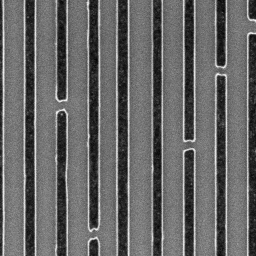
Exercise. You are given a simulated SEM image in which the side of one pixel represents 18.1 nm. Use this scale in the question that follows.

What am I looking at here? parallel lines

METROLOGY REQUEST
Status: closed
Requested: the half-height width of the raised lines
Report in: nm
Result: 197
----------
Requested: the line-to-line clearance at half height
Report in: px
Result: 20.9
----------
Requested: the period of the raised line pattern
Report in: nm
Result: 576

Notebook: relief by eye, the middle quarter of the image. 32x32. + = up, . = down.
+.....+++....+++......+++.....++
+.....+++....+++......+++.....++
+.....+++....+++......+++.....++
+.....+++....+++......+++.....++
+.....+++....+++......+++.....++
+.....+++....+++......+++.....++
+.....+++....+++......+++.....++
+.....+++....+++......+++.....++
+.....+++....+++......+++.....++
......+++....+++......+++.....++
......+++....+++......+++.....++
......+++....+++......++......++
+.....+++....+++......++......++
+.....+++....+++......++......++
+.....+++....+++......++......++
+.....+++....+++......+++.....++
+.....+++....+++......+++.....++
+.....+++....+++......++......++
+.....+++....+++......++......++
+.....+++....+++......+++.......
+.....+++....+++......+++.......
+.....+++....+++......+++......+
+.....+++....+++......+++.....++
+.....+++....+++......+++.....++
+.....+++....+++......+++.....++
+.....+++....+++......+++.....++
+.....+++....+++......+++.....++
......+++....+++......+++.....++
......+++....+++......+++.....++
+.....+++....+++......+++.....++
+.....+++....+++......+++.....++
+.....+++....+++......+++.....++